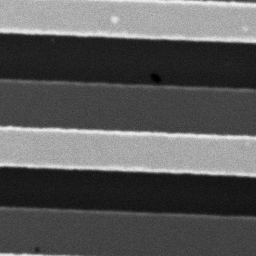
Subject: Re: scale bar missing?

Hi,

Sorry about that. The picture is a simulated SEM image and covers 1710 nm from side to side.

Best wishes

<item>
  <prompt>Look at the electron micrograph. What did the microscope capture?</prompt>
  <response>lines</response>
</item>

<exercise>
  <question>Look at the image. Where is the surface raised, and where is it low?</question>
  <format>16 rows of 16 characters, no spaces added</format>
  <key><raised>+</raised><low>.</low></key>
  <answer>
++++++++++++++++
++++++++++++++++
...........+++++
................
................
++++++++++++....
++++++++++++++++
++++++++++++++++
++++++++++++++++
++++++++++++++++
....++++++++++++
................
................
++++++++++++++..
++++++++++++++++
++++++++++++++++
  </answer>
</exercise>